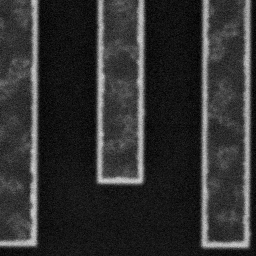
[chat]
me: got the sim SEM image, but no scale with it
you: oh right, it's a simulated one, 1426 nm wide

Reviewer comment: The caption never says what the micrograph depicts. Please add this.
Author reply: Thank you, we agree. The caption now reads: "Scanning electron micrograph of one or a few lines or trenches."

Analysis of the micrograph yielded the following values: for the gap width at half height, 356 nanometers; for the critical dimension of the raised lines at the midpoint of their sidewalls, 0.241 µm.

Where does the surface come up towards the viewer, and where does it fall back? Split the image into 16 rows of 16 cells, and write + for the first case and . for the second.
++....+++....++.
++....+++....++.
++....+++....++.
++....+++....++.
++....+++....++.
++....+++....++.
++....+++....++.
++....+++....++.
++....+++....++.
++....+++....++.
++....+++....++.
++...........++.
++...........++.
++...........++.
++...........++.
................